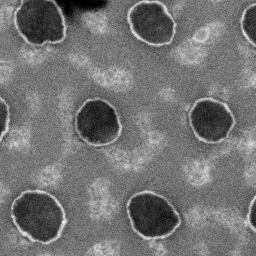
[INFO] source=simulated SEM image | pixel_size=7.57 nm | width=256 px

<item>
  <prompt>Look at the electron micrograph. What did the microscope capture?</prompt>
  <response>raised bodies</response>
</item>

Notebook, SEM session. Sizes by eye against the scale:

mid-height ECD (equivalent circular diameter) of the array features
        350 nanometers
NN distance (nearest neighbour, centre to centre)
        0.837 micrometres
